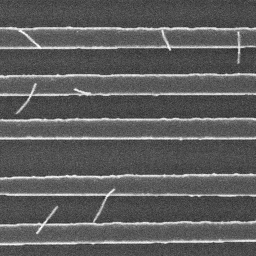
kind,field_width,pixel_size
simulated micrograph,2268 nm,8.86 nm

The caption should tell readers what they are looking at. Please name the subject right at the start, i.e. lines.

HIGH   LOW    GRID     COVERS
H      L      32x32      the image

LLLLLLLLLLLLLLLLLLLLLLLLLLLLLLLL
LLLLLLLLLLLLLLLLLLLLLLLLLLLLLLLL
LLLLLLLLLLLLLLLLLLLLLLLLLLLLLLLL
HHLLHHHHHHHHHHHLLHLLHHHHHHHLLLHH
HHHHHHHHHHHHHHHHHHHHHHHHHHHHHHHH
HHHHHHHHHHHHHHHHHHHHHHHHHHHHHHHH
LLLLLLLLLLLLLLLLLLLLLLLLLLLLLLLL
LLLLLLLLLLLLLLLLLLLLLLLLLLLLLLLL
LLLLLLLLLLLLLLLLLLLLLLLLLLLLLLLL
LHHHHHHHHHHHHHHHHHHHHHHHHHHHHHHH
HHHHHHHHHHHHHHHHHHHHHHHHHHHHHHHH
HHHHHHHHHHHHHHHHHHHHHHHHHHHHHHHH
LLLLLLLLLLLLLLLLLLLLLLLLLLLLLLLL
LLLLLLLLLLLLLLLLLLLLLLLLLLLLLLLL
LLLLLLLLLLLLLLLLLLLLLLLLLLLLLLLL
HHHHHHHHHHHHHHHHHHHHHHHHHHHHHHHH
HHHHHHHHHHHHHHHHHHHHHHHHHHHHHHHH
LLLLLLLLLLLLLLLLLLLLLLLLLLLLLLLL
LLLLLLLLLLLLLLLLLLLLLLLLLLLLLLLL
LLLLLLLLLLLLLLLLLLLLLLLLLLLLLLLL
LLLLLLLLLLLLLLLLLLLLLLLLLLLLLLLL
LLLLLLLLLLLLLLLLLLLLLLLLLLLLLLLL
HHHHHHHHHHHHHHHHHHHHHHHHHHHHHHHH
HHHHHHHHHHHHHHHHHHHHHHHHHHHHHHHH
LLLLLLLLLLLLLHLLLLLLLLLLLLLLLLLL
LLLLLLLLLLLLLLLLLLLLLLLLLLLLLLLL
LLLLLLLLLLLLLLLLLLLLLLLLLLLLLLLL
LLLLLLLLLLLLLLLLLLLLLLLLLLLLLLLL
HHHHHHHHHHHHHHHHHHHHHHHHHHHHHHHH
HHHHHHHHHHHHHHHHHHHHHHHHHHHHHHHH
HHLLLLLLLLLLLLLLLLLLLLLLLLLLLLLL
LLLLLLLLLLLLLLLLLLLLLLLLLLLLLLLL